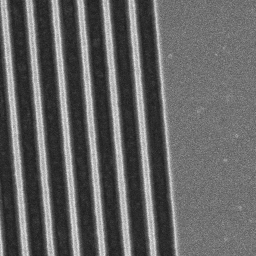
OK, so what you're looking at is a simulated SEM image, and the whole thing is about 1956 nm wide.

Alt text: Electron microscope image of parallel lines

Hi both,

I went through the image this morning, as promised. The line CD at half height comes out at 67.6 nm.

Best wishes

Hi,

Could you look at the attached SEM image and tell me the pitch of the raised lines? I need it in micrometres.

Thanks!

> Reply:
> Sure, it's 0.195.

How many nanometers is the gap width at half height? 128